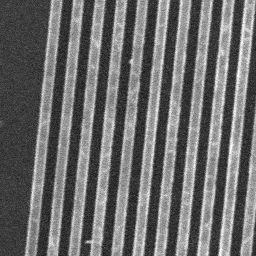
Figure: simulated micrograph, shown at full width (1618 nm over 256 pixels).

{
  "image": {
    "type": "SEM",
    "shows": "parallel lines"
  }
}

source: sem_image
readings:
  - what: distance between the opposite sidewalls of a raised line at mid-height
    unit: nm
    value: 58.2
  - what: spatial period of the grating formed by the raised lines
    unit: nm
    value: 135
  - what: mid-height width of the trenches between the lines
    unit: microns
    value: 0.0755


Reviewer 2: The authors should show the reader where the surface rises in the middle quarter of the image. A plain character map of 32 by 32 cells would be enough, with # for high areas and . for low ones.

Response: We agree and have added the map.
.##...###...##...##...##....##..
.##...##....##...##...##...###..
.##...##....##...##...##...###..
.##...##...###..###...##...###..
.##...##...##...###...##...###..
###...##...##...###...##...##...
##....##...##...###...##...##...
##...###...##...##....##...##...
##...###...##...##...###...##...
##...###...##...##...##....##...
##...###...##...##...##....##...
##...##...###...##...##....##...
##...##...###...##...##....##...
##...##...###...##...##...###...
##...##...##...###...##...##....
##...##...##...###...##...##....
#....##...##...##....##...##...#
#...###...##...##....##...##...#
#...##....##...##...###...##...#
#...##....##...##...##....##...#
#...##...###...##...##....##...#
#...##....##...##...##...###...#
#...##...###...##...##...###...#
#...##...##....##...##...###...#
#...##...##....##...##...##....#
....##...##...###...##...##....#
....##...##...##....##...##...##
...###...##...##....##...##...##
...##....##...##...###...##...##
...##....##...##...##....##...##
...##....##...##...##....##...##
...##....##...##...##...###...##